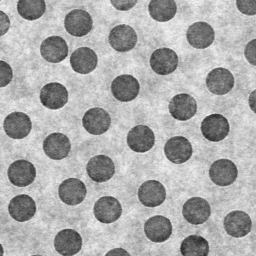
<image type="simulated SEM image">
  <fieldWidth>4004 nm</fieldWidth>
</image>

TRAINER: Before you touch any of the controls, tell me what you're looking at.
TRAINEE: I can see a regular array of holes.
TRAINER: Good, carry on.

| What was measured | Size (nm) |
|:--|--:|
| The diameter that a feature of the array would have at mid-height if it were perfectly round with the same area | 451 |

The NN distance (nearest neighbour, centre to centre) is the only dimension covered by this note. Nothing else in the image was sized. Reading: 615 nanometres